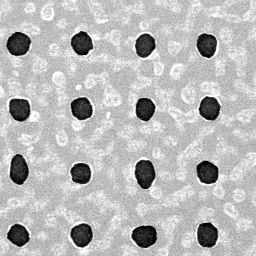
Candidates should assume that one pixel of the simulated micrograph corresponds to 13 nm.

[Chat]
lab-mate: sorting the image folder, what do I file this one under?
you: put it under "a regular array of holes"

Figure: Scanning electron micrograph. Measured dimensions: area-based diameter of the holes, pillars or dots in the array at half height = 0.307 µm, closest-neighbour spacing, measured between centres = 62.2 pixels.